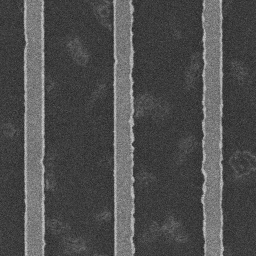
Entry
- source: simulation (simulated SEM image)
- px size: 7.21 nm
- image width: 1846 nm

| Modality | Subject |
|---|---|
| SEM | one or a few lines or trenches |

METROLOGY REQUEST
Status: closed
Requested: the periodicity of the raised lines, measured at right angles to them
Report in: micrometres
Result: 0.643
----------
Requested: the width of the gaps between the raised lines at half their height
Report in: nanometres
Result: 521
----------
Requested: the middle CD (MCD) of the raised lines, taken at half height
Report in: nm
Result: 126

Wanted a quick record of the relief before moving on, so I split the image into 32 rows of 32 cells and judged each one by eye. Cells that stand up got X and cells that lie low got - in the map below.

---XX---------XX---------XXX----
---XX---------XX---------XXX----
---XX---------XX---------XXX----
---XX---------XX---------XXX----
---XX---------XX----------XX----
---XX---------XX----------XX----
---XX---------XX----------XX----
---XX---------XX----------XX----
---XX---------XX----------XX----
---XX---------XX----------XX----
---XX---------XX----------XX----
---XX---------XX----------XX----
---XX---------XX---------XXX----
---XX---------XXX---------XX----
---XX---------XX----------XX----
---XX---------XXX--------XXX----
---XX---------XXX---------XX----
---XX---------XXX--------XXX----
---XX---------XXX--------XXX----
---XX---------XXX---------XX----
---XX---------XXX--------XXX----
---XX---------XXX--------XXX----
---XX---------XXX---------XX----
---XX---------XXX--------XXX----
---XX---------XXX--------XXX----
---XX---------XXX--------XXX----
---XX---------XXX--------XXX----
---XX---------XXX---------XX----
---XX---------XXX--------XXX----
---XX---------XXX---------XX----
---XX---------XXX---------XX----
---XX---------XXX---------XX----